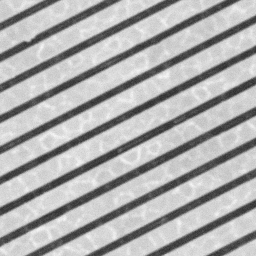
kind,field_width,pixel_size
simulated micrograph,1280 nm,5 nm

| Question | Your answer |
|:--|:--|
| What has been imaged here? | parallel lines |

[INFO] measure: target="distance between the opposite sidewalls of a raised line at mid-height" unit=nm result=97.9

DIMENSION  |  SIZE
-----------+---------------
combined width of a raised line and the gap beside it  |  137 nanometers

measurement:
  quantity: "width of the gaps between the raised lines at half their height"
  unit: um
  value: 0.0394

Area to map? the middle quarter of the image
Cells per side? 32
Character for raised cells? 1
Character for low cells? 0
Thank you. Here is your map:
11111111000011111111111000011111
11111100001111111111100001111111
11110000111111111110000111111111
11000011111111111000011111111111
00001111111111100001111111111100
00111111111110000111111111110000
11111111111000011111111111000001
11111111100000111111111100000111
11111110000011111111110000011111
11111000001111111111000001111111
11100000111111111100000111111111
10000011111111110000011111111110
00001111111111000001111111111000
00111111111100000111111111100000
11111111110000011111111110000011
11111111000001111111111000001111
11111100000111111111110000111111
11111000011111111111000011111111
11100001111111111100001111111111
10000111111111110000111111111110
00011111111111000011111111111000
01111111111100001111111111000001
11111111110000111111111110000111
11111111000011111111111000011111
11111100001111111111100000111111
11110000011111111110000011111111
11000001111111111000001111111111
00000111111111100000111111111100
00011111111110000011111111110000
01111111111000001111111111000001
11111111100000111111111100000111
11111110000011111111110000011111